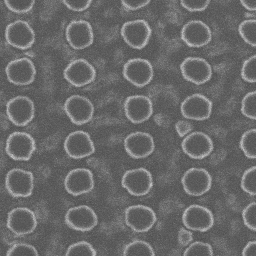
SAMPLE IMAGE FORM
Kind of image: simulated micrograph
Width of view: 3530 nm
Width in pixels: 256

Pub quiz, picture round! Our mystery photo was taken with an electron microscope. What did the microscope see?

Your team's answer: a regular array of raised bodies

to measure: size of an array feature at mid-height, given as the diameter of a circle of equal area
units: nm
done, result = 380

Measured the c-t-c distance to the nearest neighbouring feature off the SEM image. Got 502 nm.